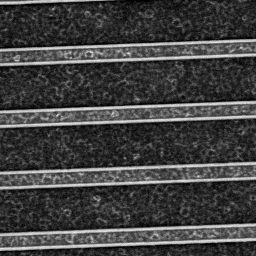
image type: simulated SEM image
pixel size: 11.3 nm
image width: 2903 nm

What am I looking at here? parallel lines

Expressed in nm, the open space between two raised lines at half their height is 521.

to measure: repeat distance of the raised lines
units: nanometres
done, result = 697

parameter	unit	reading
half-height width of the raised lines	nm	177